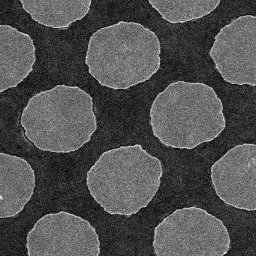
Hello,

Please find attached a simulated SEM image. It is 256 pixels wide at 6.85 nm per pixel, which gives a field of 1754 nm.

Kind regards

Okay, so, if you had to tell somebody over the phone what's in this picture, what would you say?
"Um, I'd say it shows raised bodies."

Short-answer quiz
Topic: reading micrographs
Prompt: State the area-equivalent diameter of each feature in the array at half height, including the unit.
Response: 483 nanometers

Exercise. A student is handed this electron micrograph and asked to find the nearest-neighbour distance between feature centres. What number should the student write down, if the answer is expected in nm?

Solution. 604